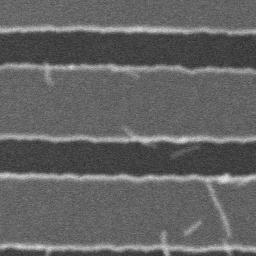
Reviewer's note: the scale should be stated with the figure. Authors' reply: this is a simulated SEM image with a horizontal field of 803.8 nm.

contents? lines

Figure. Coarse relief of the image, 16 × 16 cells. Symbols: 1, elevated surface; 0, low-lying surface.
1111111111111111
1111111111111111
0000000000000000
0000000000000000
1111111111111111
1111111111111111
1111111111111111
1111111111111111
1111111111111111
0000000000000000
0000000000000000
1111111111111111
1111111111111111
1111111111111111
1111111111111111
1111111111111111